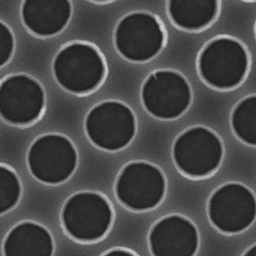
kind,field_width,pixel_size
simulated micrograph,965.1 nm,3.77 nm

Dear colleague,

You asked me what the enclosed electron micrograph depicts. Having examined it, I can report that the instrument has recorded a regular array of holes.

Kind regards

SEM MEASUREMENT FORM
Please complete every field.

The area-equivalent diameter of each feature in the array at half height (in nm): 184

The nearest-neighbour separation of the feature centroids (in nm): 240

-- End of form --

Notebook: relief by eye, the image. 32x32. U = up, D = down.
UUUDDDDDDUUUUUUUUUUUUDDDDDDUUUUU
UUUDDDDDDUUUUUUUUUUUUDDDDDDUUUUU
UUUDDDDDUUUUUUUDDDDUUUDDDDUUUUUU
DUUUDDDDUUUUUUUDDDDDUUUDDUUUUUUU
DDUUUUUUUUUUUUDDDDDDUUUUUUUUUUUU
DDUUUUUUUDUUUUUDDDDDUUUUUUDDDDUU
DDUUUUUUDDDDUUUDDDDDUUUUUDDDDDDU
DUUUUUUDDDDDDUUUDDUUUUUUUDDDDDDU
UUUUUUUDDDDDDUUUUUUUUUUUUDDDDDDU
UUDUUUUDDDDDDUUUUUUDDDDUUDDDDDUU
DDDDDUUUDDDDUUUUUUDDDDDUUUDDDDUU
DDDDDUUUUDDUUUUUUUDDDDDDUUUUUUUU
DDDDDUUUUUUUUUUUUUDDDDDDUUUUUUDD
DDDDDUUUUUUUDDDDUUDDDDDUUUUUUDDD
DDDDDUUUUUUDDDDDDUUDDDUUUUUUUDDD
UUDUUUUUUUUDDDDDDUUUUUUUUUUUUDDD
UUUUUUUUUUUDDDDDDUUUUUUDDDUUUDDD
UUUUUDDDDUUDDDDDUUUUUUDDDDDUUUDD
UUUUDDDDDUUUUDDUUUUUUUDDDDDDUUUU
UUUDDDDDDDUUUUUUUUUUUUDDDDDDUUUU
UUUUDDDDDUUUUUUUDDUUUUDDDDDUUUUU
DUUUDDDDDUUUUUUDDDDDUUUDDDUUUUUU
DDUUUDDDUUUUUUUDDDDDDUUUUUUUUUUU
DDDUUUUUUUUUUUDDDDDDDUUUUUUUDDDU
DDUUUUUUUDDDDUUDDDDDUUUUUUUDDDDD
DDUUUUUUDDDDDUUDDDDDUUUUUUDDDDDD
DUUUUUUUDDDDDDUUUUUUUUUUUUDDDDDD
UUUUUUUUDDDDDDUUUUUUDDDUUUDDDDDD
UUDDDUUUDDDDDUUUUUUDDDDDUUUDDDDU
UDDDDDUUUDDDDUUUUUUDDDDDDUUUUUUU
DDDDDDDUUUUUUUUUUUUDDDDDDUUUUUUU
UDDDDDDUUUUUUUDDUUUDDDDDUUUUUUUD